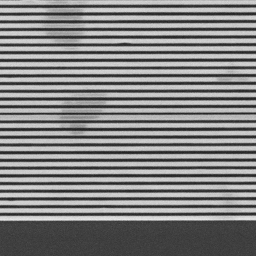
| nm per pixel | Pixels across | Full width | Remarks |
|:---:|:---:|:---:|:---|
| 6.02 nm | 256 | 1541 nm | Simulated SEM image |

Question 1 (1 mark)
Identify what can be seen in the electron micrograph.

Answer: parallel lines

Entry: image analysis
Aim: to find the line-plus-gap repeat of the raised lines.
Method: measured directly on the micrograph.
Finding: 46.4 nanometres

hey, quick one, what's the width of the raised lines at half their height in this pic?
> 27.9 nm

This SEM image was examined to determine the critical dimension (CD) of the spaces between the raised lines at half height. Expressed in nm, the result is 21.8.